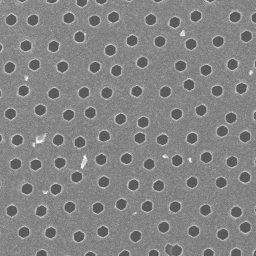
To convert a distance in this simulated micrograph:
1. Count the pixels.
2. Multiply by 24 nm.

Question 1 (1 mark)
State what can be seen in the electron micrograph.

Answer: a regular array of holes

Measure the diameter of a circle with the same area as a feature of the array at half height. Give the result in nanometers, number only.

265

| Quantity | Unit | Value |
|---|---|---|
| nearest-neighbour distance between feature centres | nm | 549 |